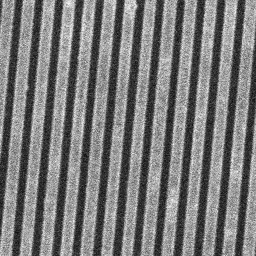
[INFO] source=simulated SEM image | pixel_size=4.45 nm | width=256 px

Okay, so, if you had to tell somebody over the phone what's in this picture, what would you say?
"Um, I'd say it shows parallel lines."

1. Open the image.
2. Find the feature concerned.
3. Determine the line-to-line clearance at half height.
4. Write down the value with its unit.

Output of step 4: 43.2 nm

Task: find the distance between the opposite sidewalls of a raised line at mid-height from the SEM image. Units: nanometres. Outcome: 47.6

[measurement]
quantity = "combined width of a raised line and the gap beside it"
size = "89.7 nanometres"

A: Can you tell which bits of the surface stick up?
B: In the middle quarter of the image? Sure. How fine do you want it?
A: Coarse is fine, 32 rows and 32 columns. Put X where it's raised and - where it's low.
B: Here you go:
X---XX---XX---XX---XX---XX---XXX
X---XX---XX---XX---XX---XX---XX-
X---XX---XX---XX---XX---XX---XX-
X---XX--XXX---XX---XX---XX---XX-
X--XXX--XXX--XXX---XX---XX---XX-
X--XXX--XXX--XXX---XX--XXX---XX-
---XXX--XXX--XXX--XXX--XXX---XX-
---XX---XXX--XXX--XXX--XXX--XXX-
---XX---XX---XXX--XXX--XXX--XXX-
---XX---XX---XXX--XX---XXX--XXX-
---XX---XX---XX---XX---XXX--XXX-
---XX---XX---XX---XX---XX---XXX-
---XX---XX---XX---XX---XX---XX--
---XX---XX---XX---XX---XX---XX--
---XX--XXX---XX---XX---XX---XX--
--XXX--XXX--XXX---XX---XX---XX--
--XXX--XXX--XXX---XX--XXX---XX--
--XX---XXX--XXX--XXX--XXX--XXX--
--XX---XXX--XX---XXX--XXX--XXX--
--XX---XX---XX---XXX--XXX--XXX--
--XX---XX---XX---XX---XXX--XXX--
--XX---XX---XX---XX---XX---XXX--
--XX---XX---XX---XX---XX---XXX--
--XX---XX---XX---XX---XX---XX---
--XX--XXX---XX---XX---XX---XX---
-XXX--XXX---XX---XX---XX---XX---
-XXX--XXX--XXX---XX---XX---XX---
-XXX--XXX--XXX---XX--XXX---XX---
-XX---XXX--XXX--XXX--XXX--XXX---
-XX---XXX--XXX--XXX--XXX--XXX---
-XX---XX---XXX--XX---XXX--XXX--X
-XX---XX---XX---XX---XXX--XXX--X